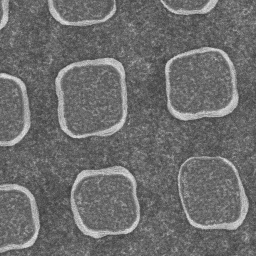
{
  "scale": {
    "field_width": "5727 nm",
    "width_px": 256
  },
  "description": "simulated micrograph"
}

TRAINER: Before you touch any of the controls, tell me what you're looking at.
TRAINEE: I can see raised bodies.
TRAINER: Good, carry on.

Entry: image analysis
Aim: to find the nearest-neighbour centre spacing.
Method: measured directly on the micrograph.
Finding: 2370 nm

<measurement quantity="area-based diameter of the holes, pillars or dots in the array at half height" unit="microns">1.58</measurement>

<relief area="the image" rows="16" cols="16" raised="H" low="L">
LLLHHHHLLLHHHLLL
LLLLLLLLLLLLLLLL
LLLLLLLLLLLLLLLL
LLLLLLLLLLLHHHLL
LLLLHHHHLLHHHHHL
HLLLHHHHLLHHHHHL
HHLLHHHHLLLHHHLL
HHLLHHHHLLLLLLLL
HLLLLHLLLLLLLLLL
LLLLLLLLLLLLLLLL
LLLLLLLLLLLHHHHL
LLLLLHHHLLLHHHHL
HHLLLHHHHLLHHHHL
HHLLLHHHHLLLHHHL
HHLLLLHHLLLLLLLL
HLLLLLLLLLLLLLLL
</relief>